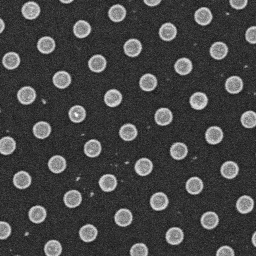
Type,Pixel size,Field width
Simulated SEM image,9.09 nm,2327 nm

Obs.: a regular array of raised bodies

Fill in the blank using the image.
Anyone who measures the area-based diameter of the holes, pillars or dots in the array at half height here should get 155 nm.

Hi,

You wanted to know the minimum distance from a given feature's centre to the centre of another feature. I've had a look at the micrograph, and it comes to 342 nm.